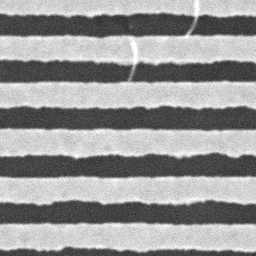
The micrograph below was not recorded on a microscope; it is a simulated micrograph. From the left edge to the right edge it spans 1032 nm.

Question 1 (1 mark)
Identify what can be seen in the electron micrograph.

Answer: lines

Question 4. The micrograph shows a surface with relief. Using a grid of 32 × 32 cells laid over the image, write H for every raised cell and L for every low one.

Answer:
HHHHHHHHHHHHHHHHHHHHHHHHHHHHHHHH
HHHHHHHHHHHHHHHHHHHHHHHHHHHHHHHH
LLLLLLLLLLLLLLLLLLLLLLLLLLLLLLLL
LLLLLLLLLLLLLLLLLLLLLLLLLLLLLLLL
LLLLLLLLHLLLLLLHLLLLLLLHHLHHHLLL
HHHHHHHHHHHHHHHHHHHHHHHHHHHHHHHH
HHHHHHHHHHHHHHHHHHHHHHHHHHHHHHHH
LLLHLHLLLLLLHHHHHLHHHHHHHHHHLHHH
LLLLLLLLLLLLLLLLLLLLLLLLLLLLLLLL
LLLLLLLLLLLLLLLLLLLLLLLLLLLLLLLL
HHHHHHHHHHHHHHHHHHHHHHHHHHHHHHHH
HHHHHHHHHHHHHHHHHHHHHHHHHHHHHHHH
HHHHHHHHHHHHHHHHHHHHHHHHHHHHHHHH
LLLLLLLLLLLLLLLLLLLLLLLLHLLLLLLL
LLLLLLLLLLLLLLLLLLLLLLLLLLLLLLLL
LLLLLLLLLLLLLLLLLLLLLLLLLLLLLLLL
HHHHHHHHHHHHHHHHHHHHHHHHHHHHHHHH
HHHHHHHHHHHHHHHHHHHHHHHHHHHHHHHH
HHHHHHHHHHHHHHHHHHHHHHHHHHHHHHHH
LLLLLLLLLHHLLLLLLLLLLLLLLLLLLHLL
LLLLLLLLLLLLLLLLLLLLLLLLLLLLLLLL
LLLLLLLLLLLLLLLLLLLLLLLLLLLLLLLL
HHHHHHHHHHHHHHHHHHHHHHHHHHHHHHHH
HHHHHHHHHHHHHHHHHHHHHHHHHHHHHHHH
HHHHHHHHHHHHHHHHHHHHHHHHHHHHHHHH
LLLLLLLLLLLLLLLLLLLLLLLLLLLLLLLL
LLLLLLLLLLLLLLLLLLLLLLLLLLLLLLLL
LLLLLLLLLLLLLLLLLLLLLLLLLLLLLLLL
HHHHHHHHHHHHHHHHHHHHHHHHHHHHHHHH
HHHHHHHHHHHHHHHHHHHHHHHHHHHHHHHH
HHHHHHHHHHHHHHHHHHHHHHHHHHHHHHHH
LLLLLLLLLLLLLLLLLLLLLLLLLLLLLLLL